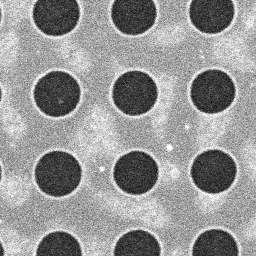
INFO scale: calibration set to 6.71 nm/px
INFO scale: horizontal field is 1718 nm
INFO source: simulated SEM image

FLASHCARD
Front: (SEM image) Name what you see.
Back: holes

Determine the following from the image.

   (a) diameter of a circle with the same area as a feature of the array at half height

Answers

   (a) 0.309 micrometres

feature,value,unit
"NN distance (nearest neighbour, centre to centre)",0.521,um